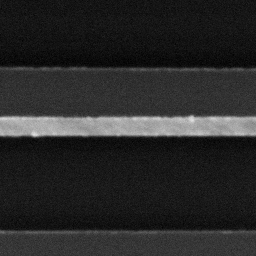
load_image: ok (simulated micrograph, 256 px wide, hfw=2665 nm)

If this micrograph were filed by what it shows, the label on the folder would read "lines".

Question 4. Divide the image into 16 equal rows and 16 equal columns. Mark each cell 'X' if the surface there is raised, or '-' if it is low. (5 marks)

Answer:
----------------
----------------
----------------
----------------
XXXXXXXXXXXXXXXX
XXXXXXXXXXXXXXXX
XXXXXXXXXXXXXXXX
XXXXXXXXXXXXXXXX
--X-------------
----------------
----------------
----------------
----------------
----------------
XXX-XXXXXXXXXXXX
XXXXXXXXXXXXXXXX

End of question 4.